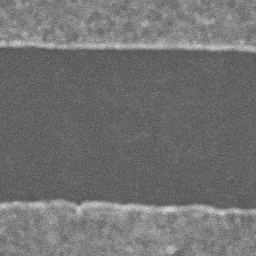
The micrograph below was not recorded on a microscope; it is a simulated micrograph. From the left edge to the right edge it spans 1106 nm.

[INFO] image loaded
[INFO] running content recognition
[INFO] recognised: one or a few lines or trenches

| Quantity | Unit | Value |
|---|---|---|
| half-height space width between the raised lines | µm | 0.697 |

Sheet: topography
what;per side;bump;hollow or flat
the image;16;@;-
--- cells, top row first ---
@@@@@@@@@@@@@@@@
@@@@@@@@@@@@@@@@
@@@@@@@@@@@@@@@@
----------------
----------------
----------------
----------------
----------------
----------------
----------------
----------------
----------------
----------------
@@@@@@@@@@@@@@@@
@@@@@@@@@@@@@@@@
@@@@@@@@@@@@@@@@